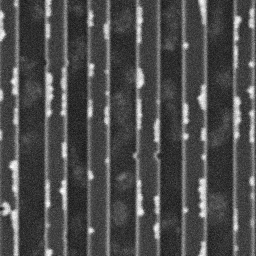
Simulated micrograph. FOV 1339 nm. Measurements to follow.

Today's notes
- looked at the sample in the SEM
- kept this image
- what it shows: parallel lines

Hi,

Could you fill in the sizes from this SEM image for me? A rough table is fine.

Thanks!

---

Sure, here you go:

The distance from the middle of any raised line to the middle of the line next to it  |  246 nm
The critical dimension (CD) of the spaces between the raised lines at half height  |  143 nanometres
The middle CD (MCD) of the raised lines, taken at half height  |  111 nm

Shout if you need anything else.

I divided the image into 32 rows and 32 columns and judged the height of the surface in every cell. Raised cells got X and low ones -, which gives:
XX----XX---XXX---XXX---XXX---XXX
XX----XX---XXX---XXX---XXX---XXX
XX----XX---XXX---XXX---XXX---XXX
XX----XX---XXX---XXX---XXX---XXX
XX----XX---XXX---XXX---XXX---XXX
XX----XX---XXX---XXX---XXX---XXX
XX----XX---XXX---XXX---XXX---XXX
XX----XX---XXX---XXX---XXX---XXX
XX----XX---XXX---XXX---XXX---XXX
XX----XX---XXX---XXX---XXX---XXX
XX----XX---XXX---XXX---XXX---XXX
XX----XX---XXX---XXX---XXX---XXX
XX----XX---XXX---XXX---XXX---XXX
XX----XX---XXX---XXX---XXX---XXX
XX----XX---XXX---XXX---XXX---XXX
XX----XX---XXX---XXX---XXX---XXX
XX----XX---XXX---XXX---XXX---XXX
XX----XX---XXX---XXX---XXX---XXX
XX----XX---XXX---XXX---XXX---XXX
XX----XX---XXX---XXX---XXX---XXX
XX----XX---XXX---XXX---XXX---XXX
XX----XX---XXX---XXX---XXX---XXX
XX----XX---XXX---XXX---XXX---XXX
XX----XX---XXX---XXX---XXX---XXX
XX----XX---XXX---XXX---XXX---XXX
XX----XX---XXX---XXX---XXX---XXX
XX----XX---XXX---XXX---XXX---XXX
XX----XX---XXX---XXX---XXX---XXX
XX----XX---XXX---XXX---XXX---XXX
XX----XX---XXX---XXX---XXX---XXX
XX----XX---XXX---XXX---XXX---XXX
XX----XX---XXX---XXX---XXX---XXX